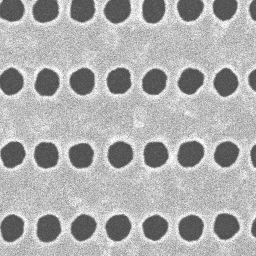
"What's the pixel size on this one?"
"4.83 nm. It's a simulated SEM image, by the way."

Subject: a regular array of holes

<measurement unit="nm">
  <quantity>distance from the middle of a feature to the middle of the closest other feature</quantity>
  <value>170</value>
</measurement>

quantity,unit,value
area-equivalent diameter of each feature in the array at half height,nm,125